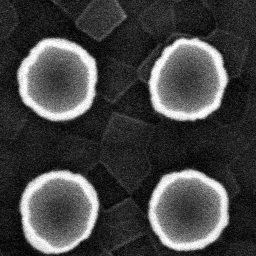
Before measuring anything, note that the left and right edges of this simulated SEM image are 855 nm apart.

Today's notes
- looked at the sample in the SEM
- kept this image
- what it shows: raised bodies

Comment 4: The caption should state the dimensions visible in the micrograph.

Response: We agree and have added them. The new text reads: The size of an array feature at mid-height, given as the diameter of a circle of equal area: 0.247 micrometres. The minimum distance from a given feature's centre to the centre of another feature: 129 px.